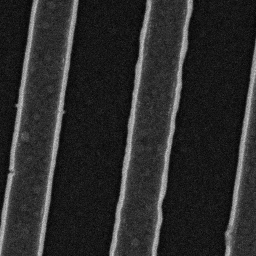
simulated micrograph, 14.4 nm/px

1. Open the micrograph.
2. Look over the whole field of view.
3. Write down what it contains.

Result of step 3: one or a few lines or trenches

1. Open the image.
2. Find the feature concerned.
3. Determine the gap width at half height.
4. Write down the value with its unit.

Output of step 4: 1.04 µm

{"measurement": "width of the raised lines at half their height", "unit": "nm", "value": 594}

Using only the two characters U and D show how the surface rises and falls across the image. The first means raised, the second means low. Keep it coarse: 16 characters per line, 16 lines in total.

DDUUUDDDDUUUDDDD
DDUUUDDDDUUUDDDD
DDUUDDDDDUUUDDDD
DDUUDDDDDUUDDDDD
DDUUDDDDDUUDDDDD
DUUUDDDDDUUDDDDD
DUUUDDDDUUUDDDDD
DUUUDDDDUUUDDDDU
DUUUDDDDUUUDDDDU
DUUDDDDDUUUDDDDU
DUUDDDDDUUDDDDDU
DUUDDDDDUUDDDDDU
UUUDDDDDUUDDDDDU
UUUDDDDUUUDDDDDU
UUUDDDDUUUDDDDUU
UUUDDDDUUUDDDDUU